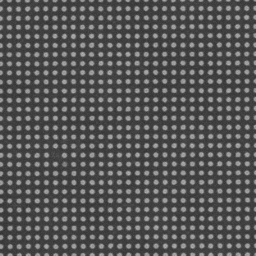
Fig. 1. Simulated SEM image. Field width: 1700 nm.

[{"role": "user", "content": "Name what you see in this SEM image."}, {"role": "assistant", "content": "a regular array of raised bodies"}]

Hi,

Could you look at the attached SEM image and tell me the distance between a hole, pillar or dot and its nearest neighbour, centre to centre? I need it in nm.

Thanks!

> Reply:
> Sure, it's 57.9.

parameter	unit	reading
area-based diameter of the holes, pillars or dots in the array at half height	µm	0.0318